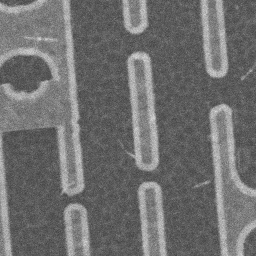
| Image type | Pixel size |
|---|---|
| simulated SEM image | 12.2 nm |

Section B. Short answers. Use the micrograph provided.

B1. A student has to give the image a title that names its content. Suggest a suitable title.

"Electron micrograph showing one or a few lines or trenches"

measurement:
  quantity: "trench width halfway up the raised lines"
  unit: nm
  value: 732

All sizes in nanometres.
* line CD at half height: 207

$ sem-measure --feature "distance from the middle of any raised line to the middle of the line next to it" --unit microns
0.955